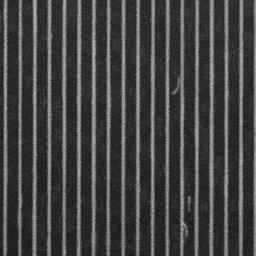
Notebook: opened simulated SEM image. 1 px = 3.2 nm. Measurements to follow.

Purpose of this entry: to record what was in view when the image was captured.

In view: parallel lines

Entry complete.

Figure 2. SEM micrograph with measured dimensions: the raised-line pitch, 47 nm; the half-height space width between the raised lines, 12.1 px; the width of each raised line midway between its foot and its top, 7.6 nm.